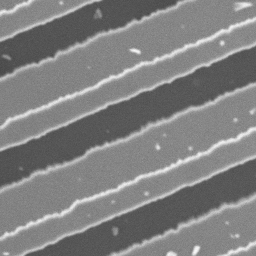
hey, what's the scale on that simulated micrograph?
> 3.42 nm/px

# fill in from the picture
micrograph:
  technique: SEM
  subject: lines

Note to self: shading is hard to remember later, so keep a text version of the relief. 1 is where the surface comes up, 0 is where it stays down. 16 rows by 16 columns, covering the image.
1111100000011111
1110000011111111
0000001111111111
0001111111111100
0111111111110000
1111111111000001
1111111000000111
1111100000111111
1110000011111111
0000001111111111
0001111111111100
0111111111110000
1111111111000001
1111111000000111
1111100000011111
1110000011111111